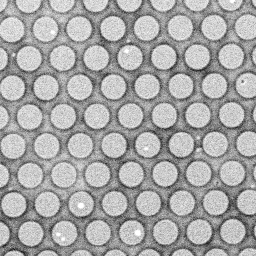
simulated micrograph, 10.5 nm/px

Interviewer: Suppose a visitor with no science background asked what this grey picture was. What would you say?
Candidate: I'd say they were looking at an array of small figures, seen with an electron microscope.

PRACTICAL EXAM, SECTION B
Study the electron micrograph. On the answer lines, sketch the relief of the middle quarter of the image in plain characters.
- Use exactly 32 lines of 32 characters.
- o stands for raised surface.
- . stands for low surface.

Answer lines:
oo....oooo....ooooo....oooo....o
................................
................................
..oooo....oooo.....oooo....oooo.
.oooooo...ooooo...oooooo..oooooo
.oooooo..oooooo...oooooo..oooooo
.oooooo..oooooo...oooooo..oooooo
.ooooo....ooooo...ooooo....oooo.
...oo......oo.......oo..........
................................
o......ooo.....ooo.....oooo.....
oo....ooooo...ooooo...oooooo...o
ooo..oooooo...oooooo..oooooo...o
ooo..oooooo...oooooo..oooooo...o
oo....ooooo...ooooo....ooooo...o
oo....oooo.....ooo......ooo.....
................................
...oo...............oo......ooo.
..oooo....ooooo...ooooo....ooooo
.oooooo...ooooo...oooooo...ooooo
.oooooo...ooooo...oooooo..oooooo
.oooooo...ooooo...oooooo...ooooo
..oooo....ooooo....oooo....oooo.
................................
................................
oo....oooo.....oooo....oooo....o
ooo...ooooo...oooooo..oooooo...o
ooo..oooooo...oooooo..oooooo...o
ooo...ooooo...oooooo..oooooo...o
oo....ooooo....oooo....oooo....o
o......oo.......................
................................